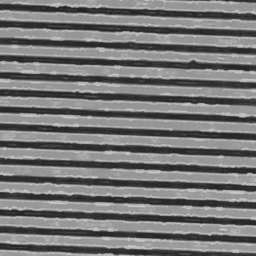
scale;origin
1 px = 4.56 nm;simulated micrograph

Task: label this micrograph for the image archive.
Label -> parallel lines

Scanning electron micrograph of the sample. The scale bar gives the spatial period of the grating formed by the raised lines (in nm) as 78.1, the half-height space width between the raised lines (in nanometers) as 27.3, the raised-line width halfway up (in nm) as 50.7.